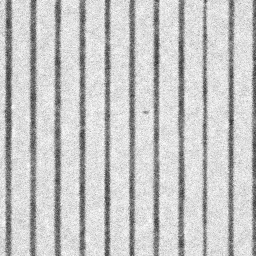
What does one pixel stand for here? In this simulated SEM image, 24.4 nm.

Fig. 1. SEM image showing parallel lines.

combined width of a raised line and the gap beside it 0.603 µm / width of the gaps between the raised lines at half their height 0.168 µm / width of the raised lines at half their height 436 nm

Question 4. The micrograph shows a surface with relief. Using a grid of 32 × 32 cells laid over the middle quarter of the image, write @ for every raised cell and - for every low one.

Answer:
@@@@--@@@@--@@@@--@@@@--@@@@--@@
@@@@--@@@@--@@-@--@@@@--@@-@--@@
@@@@--@@@@--@@@@--@@@@--@@@@--@@
@@@@--@@@@--@@@@--@@@@--@@@@--@@
@@@@--@@@@--@@@@--@@@@--@@@@--@@
@@@@--@@@@--@@@@--@@@@--@@@@--@@
@@@@--@@@@--@@@@--@@@@--@@@@--@@
@@@@--@@@@--@@@@--@@@@--@@@@--@@
@@@@--@@@@--@@@@--@@@@--@@@@--@@
@@@@--@@@@--@@@@--@@@@--@@@@--@@
@@@@--@@@@--@@@@--@@@@--@@@@--@@
@@@@--@@@@--@@@@--@-----@@@@--@@
@@@@--@@@@--@@@@--@-----@@@@--@@
@@@@--@@@@--@@@@--@@----@@@@--@@
@@@@--@@@@--@@@@--@@@@--@@@@--@@
@@@@--@@@@--@@@@--@@@@--@@@@--@@
@@@@--@@@@--@@@@--@@@@--@@@@--@@
-@@@--@@@@--@@@@--@@@@--@@@@--@@
-@@@--@@@@--@@@@--@@@@--@@@---@@
@@@@--@@@@--@@@@--@@@@--@@@@--@@
@@@@--@@@@--@@@@--@@@@--@@@@--@@
@-@@--@@@@--@@@@--@@@@--@@@@--@@
@@@@--@@@@--@@@@--@@@@--@@@@--@@
@@@@--@@@@--@@@@--@@@@--@@@@--@@
@@@@--@@@@--@@@@--@@@@--@@@@--@@
@@@@--@@@@--@@@@--@@@@--@@@@--@@
@@@@--@@@@--@@@@--@@@@--@@@@--@@
@@@@--@@@@--@@@@--@@@@--@@@@--@@
@@@@--@@@@--@@@@--@@@@--@@@@--@@
@@@@--@@@@--@@@@--@@@@--@@@@--@@
@@@@--@@@@--@@@@--@@@@--@@@@--@@
@@@@--@@@@--@@@@--@@@@--@@@@--@@